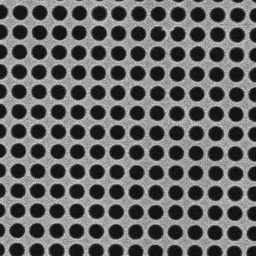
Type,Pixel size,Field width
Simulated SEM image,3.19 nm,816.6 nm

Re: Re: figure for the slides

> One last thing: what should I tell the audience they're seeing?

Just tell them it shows a regular array of holes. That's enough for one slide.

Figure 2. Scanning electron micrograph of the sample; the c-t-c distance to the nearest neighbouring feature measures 0.0624 µm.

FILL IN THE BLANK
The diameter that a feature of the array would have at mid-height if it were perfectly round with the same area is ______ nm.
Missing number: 47.6